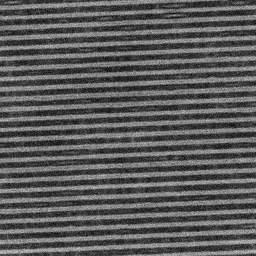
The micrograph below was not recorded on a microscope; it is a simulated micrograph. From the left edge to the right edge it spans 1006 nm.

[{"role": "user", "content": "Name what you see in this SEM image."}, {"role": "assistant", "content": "parallel lines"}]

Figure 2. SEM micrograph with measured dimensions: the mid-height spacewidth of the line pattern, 26.5 nm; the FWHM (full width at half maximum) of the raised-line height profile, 3.51 px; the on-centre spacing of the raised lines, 40 nanometres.